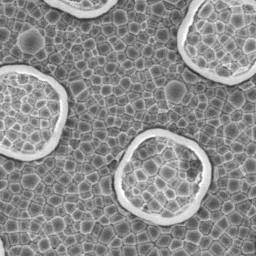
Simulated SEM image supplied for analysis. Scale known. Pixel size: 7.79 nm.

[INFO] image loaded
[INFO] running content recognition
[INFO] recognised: raised bodies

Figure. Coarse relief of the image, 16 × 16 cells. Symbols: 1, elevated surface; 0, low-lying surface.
0000111000001111
0000000000001111
0000000000011111
0000000000001111
1100000000000111
1111000000000000
1111000000000000
1111000000000000
1111000001100000
1110000011111000
0000000011111000
0000000111111000
0000000011110000
0000000001110000
0000000000000000
0000000000000000